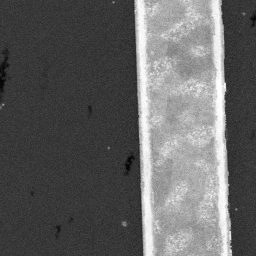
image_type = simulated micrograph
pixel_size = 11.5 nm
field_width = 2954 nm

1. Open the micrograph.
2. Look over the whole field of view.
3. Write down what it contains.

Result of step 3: one or a few lines or trenches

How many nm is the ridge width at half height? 874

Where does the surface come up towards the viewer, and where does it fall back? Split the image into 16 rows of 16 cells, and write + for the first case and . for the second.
.........+++++..
.........+++++..
.........+++++..
.........+++++..
.........+++++..
.........+++++..
.........+++++..
.........+++++..
.........+++++..
.........+++++..
.........+++++..
.........+++++..
.........+++++..
.........+++++..
.........+++++..
.........+++++..